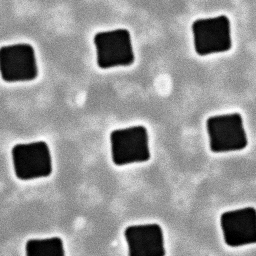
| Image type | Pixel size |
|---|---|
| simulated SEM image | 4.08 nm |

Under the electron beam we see holes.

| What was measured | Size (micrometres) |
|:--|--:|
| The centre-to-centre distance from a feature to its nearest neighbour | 0.401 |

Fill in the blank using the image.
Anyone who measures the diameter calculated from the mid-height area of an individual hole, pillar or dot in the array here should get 168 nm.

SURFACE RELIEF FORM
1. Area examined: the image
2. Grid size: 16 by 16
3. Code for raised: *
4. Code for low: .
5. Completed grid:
****************
************..**
******..****..**
..****..********
..**************
****************
****************
*************..*
*******..****..*
*..****..*******
*..*************
****************
****************
**************..
********..****..
**..****..******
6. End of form